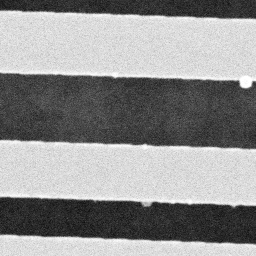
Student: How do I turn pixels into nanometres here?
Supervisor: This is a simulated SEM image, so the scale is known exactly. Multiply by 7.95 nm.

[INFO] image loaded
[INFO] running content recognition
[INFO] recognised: lines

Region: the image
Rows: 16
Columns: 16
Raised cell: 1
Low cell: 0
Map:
0000000000000000
1111111111111111
1111111111111111
1111111111111111
1111111111111111
0000000000000000
0000000000000000
0000000000000000
0000000000000000
1111111111111111
1111111111111111
1111111111111111
0000000011111111
0000000000000000
0000000000000000
1111111111111111